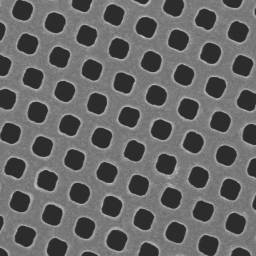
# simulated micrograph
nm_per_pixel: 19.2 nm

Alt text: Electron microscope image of a regular array of holes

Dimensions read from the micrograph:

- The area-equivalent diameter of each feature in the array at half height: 0.4 um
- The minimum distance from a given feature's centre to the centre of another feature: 659 nanometres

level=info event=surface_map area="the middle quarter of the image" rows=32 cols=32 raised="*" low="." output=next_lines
.****.....*********.....*****..*
****......**********...*****....
****.....****...************....
*****....****....**********.....
.***********......**********....
...*********.....*****..******.*
...**********....****....*******
...****..************.....******
..****.....*********......******
.*****.....**********....****...
******.....******************...
******....****....**********....
********.*****.....**********...
...***********.....***********..
....**********....*****...******
....***********...****.....*****
....****...***********.....*****
...****.....**********.....****.
*******.....***********...****..
*******.....****..************..
********...*****....**********..
*..************.....***********.
*....**********.....****..******
.....***********....***.....****
.....******************.....****
*....****....**********.....****
***.****.....**********.....****
********.....************..****.
********.....****....**********.
**********..****.....**********.
**....**********.....***********
**....**********.....****...****